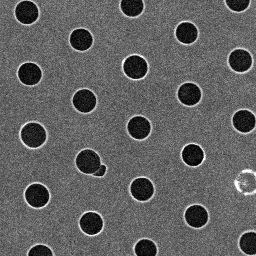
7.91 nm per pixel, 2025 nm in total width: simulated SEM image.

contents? a regular array of holes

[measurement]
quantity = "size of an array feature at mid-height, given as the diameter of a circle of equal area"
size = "185 nanometers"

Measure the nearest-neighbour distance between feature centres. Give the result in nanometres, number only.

478